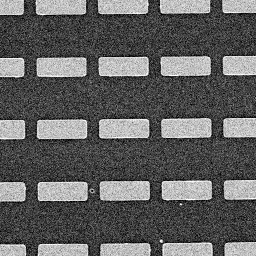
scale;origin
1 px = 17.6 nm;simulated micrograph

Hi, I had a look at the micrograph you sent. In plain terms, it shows an array of small figures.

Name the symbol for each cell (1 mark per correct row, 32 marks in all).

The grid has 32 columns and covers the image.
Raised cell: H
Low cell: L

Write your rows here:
HHHLLHHHHHHLHHHHHHLLHHHHHHLLHHHH
HHHLLHHHHHHLLHHHHHLLHHHHHHLLHHHL
LLLLLLLLLLLLLLLLLLLLLLLLLLLLLLLL
LLLLLLLLLLLLLLLLLLLLLLLLLLLLLLLL
LLLLLLLLLLLLLLLLLLLLLLLLLLLLLLLL
LLLLLLLLLLLLLLLLLLLLLLLLLLLLLLLL
LLLLLLLLLLLLLLLLLLLLLLLLLLLLLLLL
HHHLLHHHHHHLLHHHHHLLHHHHHHLLHHHH
HHHLLHHHHHHLHHHHHHLLHHHHHHLLHHHH
HHHLLLLHLLLLLLLLLLLLLLLLLLLLLLLL
LLLLLLLLLLLLLLLLLLLLLLLLLLLLLLLL
LLLLLLLLLLLLLLLLLLLLLLLLLLLLLLLL
LLLLLLLLLLLLLLLLLLLLLLLLLLLLLLLL
LLLLLLLLLLLLLLLLLLLLLLLLLLLLLLLL
LLLLLLLLLLLLLLLLLLLLLLLLLLLLLLLL
HHHLLHHHHHHLLHHHHHHLHHHHHHLLHHHH
HHHLLHHHHHHLLHHHHHHLHHHHHHLLHHHH
LLLLLLLLLLLLLLLLLLLLLLLLLLLLLLLL
LLLLLLLLLLLLLLLLLLLLLLLLLLLLLLLL
LLLLLLLLLLLLLLLLLLLLLLLLLLLLLLLL
LLLLLLLLLLLLLLLLLLLLLLLLLLLLLLLL
LLLLLLLLLLLLLLLLLLLLLLLLLLLLLLLL
LLLLLLLLLLLLLLLLLLLLLLLLLLLLLLLL
HHHLLHHHHHHLLHHHHHHLHHHHHHLLHHHH
HHHLLHHHHHHLLHHHHHHLHHHHHHLLHHHH
LLLLLLLLLLLLLLLLLLLLLLLLLLLLLLLL
LLLLLLLLLLLLLLLLLLLLLLLLLLLLLLLL
LLLLLLLLLLLLLLLLLLLLLLLLLLLLLLLL
LLLLLLLLLLLLLLLLLLLLLLLLLLLLLLLL
LLLLLLLLLLLLLLLLLLLLLLLLLLLLLLLL
LLLLLLLLLLLLLLLLLLLLLHHHHHLLHHHH
HHHLLHHHHHHLLHHHHHHLHHHHHHLLHHHH